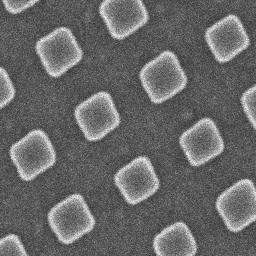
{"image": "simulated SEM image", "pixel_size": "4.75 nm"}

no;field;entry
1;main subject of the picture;a regular array of raised bodies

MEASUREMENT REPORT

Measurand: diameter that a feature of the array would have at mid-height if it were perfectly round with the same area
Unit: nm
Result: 198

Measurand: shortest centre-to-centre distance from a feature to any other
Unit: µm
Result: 0.356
